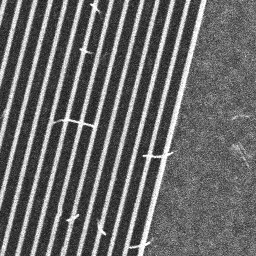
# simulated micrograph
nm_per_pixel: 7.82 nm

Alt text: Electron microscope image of parallel lines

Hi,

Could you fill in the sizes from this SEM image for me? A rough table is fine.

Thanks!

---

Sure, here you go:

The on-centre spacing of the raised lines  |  116 nm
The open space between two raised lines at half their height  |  80.6 nanometers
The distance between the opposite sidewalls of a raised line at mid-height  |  29.4 nm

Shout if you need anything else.